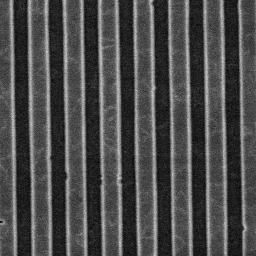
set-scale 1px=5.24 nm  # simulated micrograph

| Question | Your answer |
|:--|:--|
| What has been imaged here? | parallel lines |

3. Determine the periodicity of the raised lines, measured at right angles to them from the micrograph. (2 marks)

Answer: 184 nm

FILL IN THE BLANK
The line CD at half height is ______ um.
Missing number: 0.097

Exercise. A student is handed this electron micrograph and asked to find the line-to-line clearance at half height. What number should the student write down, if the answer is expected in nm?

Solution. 87.1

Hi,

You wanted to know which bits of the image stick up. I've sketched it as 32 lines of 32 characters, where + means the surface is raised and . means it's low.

+...++..++..+++..++..++...++..++
+...++..++..+++..++..++...++..++
+...++..++..+++..++..++...++..++
+...++..++..+++..++..++...++..++
+...++..++..+++..++..++...++..++
++..++..++..+++..++..++...++..++
++..++..++..+++..++..++...++..++
++..++..++...++..++..++...++..++
++..++..++...++..++..+++..++..++
++..++..++...++..++..+++..++..++
++..++..++...++..++..+++..++..++
++..++..++...++..++..+++..++..++
++..++..++...++..++..+++..++..++
++..++..++...++..++..+++..++..++
++..++..++...++..++..+++..++..++
++..++..++...++..++..+++..++..++
++..++..++...++..++..+++..++..++
++..++..++...++..++..+++..++..++
++..++..++...++..++..+++..++..++
++..++..+++..++..++..+++..++..++
++..++..+++..++..++..+++..++..++
++..++..+++..++..++...++..++..++
++..++..+++..++..++...++..++..++
++..++..+++..++..++...++..++..++
++..++..+++..++..++...++..++..++
++..++..+++..++..++...++..++..++
++..++..+++..++..++...++..++..++
++..++..+++..++..++...++..++..++
++..++..+++..++..++...++..++...+
++..++..+++..++..++...++..++..++
++..++..+++..++..++...++..++..++
++..++..+++..++..++...++..++..++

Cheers